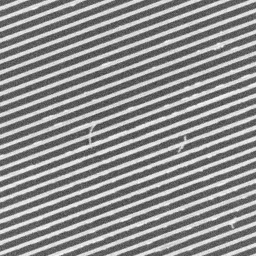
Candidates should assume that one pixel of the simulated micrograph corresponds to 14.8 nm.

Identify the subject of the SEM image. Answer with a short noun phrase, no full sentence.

parallel lines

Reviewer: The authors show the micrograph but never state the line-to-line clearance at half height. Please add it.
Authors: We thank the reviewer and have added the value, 7.04 pixels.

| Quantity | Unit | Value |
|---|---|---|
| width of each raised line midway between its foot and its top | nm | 34.7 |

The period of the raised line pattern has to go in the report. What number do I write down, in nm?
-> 148